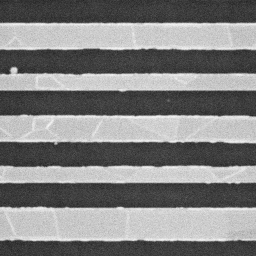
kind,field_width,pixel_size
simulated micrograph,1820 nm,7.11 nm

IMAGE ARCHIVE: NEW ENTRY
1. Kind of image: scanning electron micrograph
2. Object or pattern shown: lines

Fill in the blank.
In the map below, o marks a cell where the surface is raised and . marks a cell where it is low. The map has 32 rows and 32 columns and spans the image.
................................
................................
................................
oooooooooooooooooooooooooooooooo
oooooooooooooooooooooooooooooooo
oooooooooooooooooooooooooooooooo
................................
................................
................................
oooooooooooooooooooooooooooooooo
oooooooooooooooooooooooooooooooo
................................
................................
................................
...o............................
oooooooooooooooooooooooooooooooo
oooooooooooooooooooooooooooooooo
oooooooooooooooooooooooooooooooo
................................
................................
................................
oooooooooooooooooooooooooooooooo
oooooooooooooooooooooooooooooooo
................................
................................
................................
oooooooooooooooooooooooooooooooo
oooooooooooooooooooooooooooooooo
oooooooooooooooooooooooooooooooo
oooooooooooooooooooooooooooooooo
................................
................................